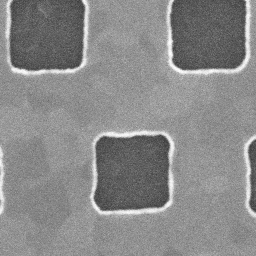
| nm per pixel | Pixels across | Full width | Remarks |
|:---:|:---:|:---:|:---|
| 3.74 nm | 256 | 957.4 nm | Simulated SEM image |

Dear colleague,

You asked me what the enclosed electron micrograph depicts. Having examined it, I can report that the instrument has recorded holes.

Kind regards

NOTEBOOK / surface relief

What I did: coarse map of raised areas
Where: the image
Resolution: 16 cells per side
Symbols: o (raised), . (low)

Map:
o....oooooo....o
o....oooooo....o
o....oooooo....o
o....oooooo....o
oooooooooooooooo
oooooooooooooooo
oooooooooooooooo
oooooooooooooooo
oooooo.o..oooooo
oooooo.....ooooo
oooooo.....ooooo
oooooo.....ooooo
oooooo.....ooooo
oooooooooooooooo
oooooooooooooooo
oooooooooooooooo